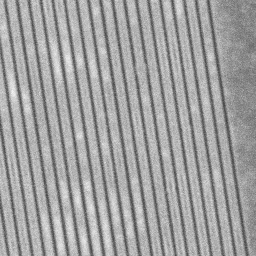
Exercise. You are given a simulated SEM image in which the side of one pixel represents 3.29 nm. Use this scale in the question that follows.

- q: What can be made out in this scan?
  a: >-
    parallel lines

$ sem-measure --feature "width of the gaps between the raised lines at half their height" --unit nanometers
11.4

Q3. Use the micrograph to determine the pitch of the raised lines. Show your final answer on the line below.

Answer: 38.8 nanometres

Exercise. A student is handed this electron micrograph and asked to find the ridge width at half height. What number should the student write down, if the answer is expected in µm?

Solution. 0.0285